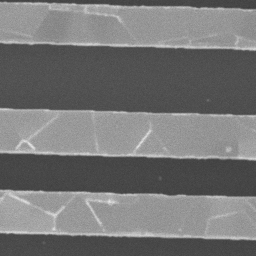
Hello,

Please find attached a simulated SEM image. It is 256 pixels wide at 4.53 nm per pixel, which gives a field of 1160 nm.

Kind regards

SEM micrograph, lines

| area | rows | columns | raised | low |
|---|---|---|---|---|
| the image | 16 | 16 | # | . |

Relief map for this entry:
##############..
################
################
................
................
................
................
################
################
################
................
................
################
################
################
................